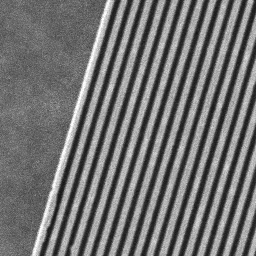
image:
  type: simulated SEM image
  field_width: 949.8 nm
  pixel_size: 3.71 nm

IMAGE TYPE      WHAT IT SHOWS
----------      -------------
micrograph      parallel lines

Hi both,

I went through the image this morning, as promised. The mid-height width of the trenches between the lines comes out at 22.3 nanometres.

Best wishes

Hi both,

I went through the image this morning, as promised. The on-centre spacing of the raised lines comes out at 45.1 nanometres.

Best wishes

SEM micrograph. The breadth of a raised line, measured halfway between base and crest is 0.0223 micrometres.